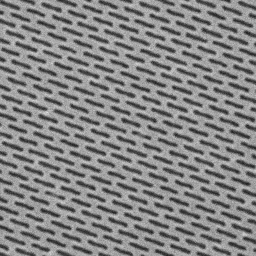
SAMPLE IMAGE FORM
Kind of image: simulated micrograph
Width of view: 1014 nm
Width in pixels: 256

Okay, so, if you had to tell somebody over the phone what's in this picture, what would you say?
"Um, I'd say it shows a regular array of holes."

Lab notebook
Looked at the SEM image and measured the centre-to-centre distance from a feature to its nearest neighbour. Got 63.5 nm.